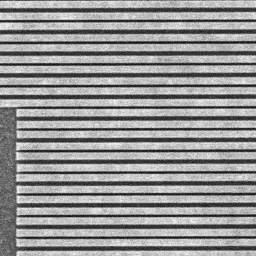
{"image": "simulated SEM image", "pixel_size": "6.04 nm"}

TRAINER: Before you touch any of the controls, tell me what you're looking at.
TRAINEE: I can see parallel lines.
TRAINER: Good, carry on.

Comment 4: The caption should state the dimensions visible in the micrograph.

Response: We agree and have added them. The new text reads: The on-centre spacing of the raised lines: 65.3 nm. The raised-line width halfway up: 40.8 nm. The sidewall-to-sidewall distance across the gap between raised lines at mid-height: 23.4 nanometers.